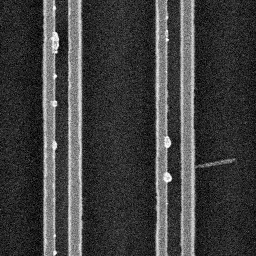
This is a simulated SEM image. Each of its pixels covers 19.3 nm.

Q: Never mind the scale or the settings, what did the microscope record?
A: lines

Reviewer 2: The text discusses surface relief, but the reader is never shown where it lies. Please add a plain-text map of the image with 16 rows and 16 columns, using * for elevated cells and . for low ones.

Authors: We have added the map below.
...**.....**....
...**.....**....
...**.....**....
...**.....**....
...**.....**....
...**.....**....
...**.....**....
...**.....**....
...**.....**....
...**.....**....
...**.....**....
...**.....**....
...**.....**....
...**.....**....
...**.....**....
...**.....**....